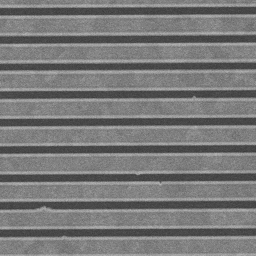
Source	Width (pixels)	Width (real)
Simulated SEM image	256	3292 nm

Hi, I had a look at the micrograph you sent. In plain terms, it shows parallel lines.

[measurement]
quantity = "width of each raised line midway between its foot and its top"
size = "217 nanometres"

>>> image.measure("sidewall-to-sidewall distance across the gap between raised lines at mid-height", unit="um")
0.137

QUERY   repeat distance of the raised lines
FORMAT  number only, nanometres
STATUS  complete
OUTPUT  356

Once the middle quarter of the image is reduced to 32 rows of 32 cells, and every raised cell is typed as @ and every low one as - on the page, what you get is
--------------------------------
--------------------------------
@@@@@@@@@@@@@@@@@@@@@@@@@@@@@@@@
@@@@@@@@@@@@@@@@@@@@@@@@@@@@@@@@
@@@@@@@@@@@@@@@@@@@@@@@@@@@@@@@@
@@@@@@@@@@@@@@@@@@@@@@@@@@@@@@@@
--------------------------------
--------------------------------
--------------------------------
@@@@@@@@@@@@@@@@@@@@@@@@@@@@@@@@
@@@@@@@@@@@@@@@@@@@@@@@@@@@@@@@@
@@@@@@@@@@@@@@@@@@@@@@@@@@@@@@@@
@@@@@@@@@@@@@@@@@@@@@@@@@@@@@@@@
--------------------------------
--------------------------------
--------------------------------
@@@@@@@@@@@@@@@@@@@@@@@@@@@@@@@@
@@@@@@@@@@@@@@@@@@@@@@@@@@@@@@@@
@@@@@@@@@@@@@@@@@@@@@@@@@@@@@@@@
@@@@@@@@@@@@@@@@@@@@@@@@@@@@@@@@
--------------------------------
--------------------------------
--------------------------------
@@@@@@@@@@@@@@@@@@@@@@@@@@@@@@@@
@@@@@@@@@@@@@@@@@@@@@@@@@@@@@@@@
@@@@@@@@@@@@@@@@@@@@@@@@@@@@@@@@
@@@@@@@@@@@@@@@@@@@@@@@@@@@@@@@@
--------------------------------
--------------------------------
--------------------------------
@@@@@@@@@@@@@@@@@@@@@@@@@@@@@@@@
@@@@@@@@@@@@@@@@@@@@@@@@@@@@@@@@